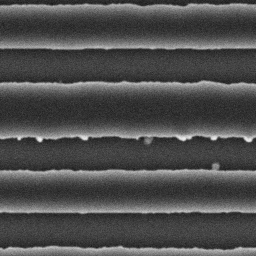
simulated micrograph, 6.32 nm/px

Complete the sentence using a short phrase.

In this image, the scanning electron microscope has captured lines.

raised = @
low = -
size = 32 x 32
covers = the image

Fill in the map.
--------------------------------
@@@@@@@@@@@@@@@@@@@@@@@@@@@@@@@@
@@@@@@@@@@@@@@@@@@@@@@@@@@@@@@@@
@@@@@@@@@@@@@@@@@@@@@@@@@@@@@@@@
@@@@@@@@@@@@@@@@@@@@@@@@@@@@@@@@
@@@@@@@@@@@@@@@@@@@@@@@@@@@@@@@@
--------------------------------
--------------------------------
--------------------------------
--------------------------------
@@@@@@@@-@@@@@@@@@@@@@@@@@@@-@@-
@@@@@@@@@@@@@@@@@@@@@@@@@@@@@@@@
@@@@@@@@@@@@@@@@@@@@@@@@@@@@@@@@
@@@@@@@@@@@@@@@@@@@@@@@@@@@@@@@@
@@@@@@@@@@@@@@@@@@@@@@@@@@@@@@@@
@@@@@@@@@@@@@@@@@@@@@@@@@@@@@@@@
@@@@@@@@@@@@@@@@@@@@@@@@@@@@@@@@
--------------------------------
--------------------------------
--------------------------------
--------------------------------
@@@@-@@@@@@@@@@@@@@@@@@@@@@@@@@@
@@@@@@@@@@@@@@@@@@@@@@@@@@@@@@@@
@@@@@@@@@@@@@@@@@@@@@@@@@@@@@@@@
@@@@@@@@@@@@@@@@@@@@@@@@@@@@@@@@
@@@@@@@@@@@@@@@@@@@@@@@@@@@@@@@@
@@@@@@@@@@@@@@@@@@@@@@@@-@@@@-@@
--------------------------------
--------------------------------
--------------------------------
--------------------------------
@@@@@@@@@@@@@@@@@@@@@@@@@@@@@@@@